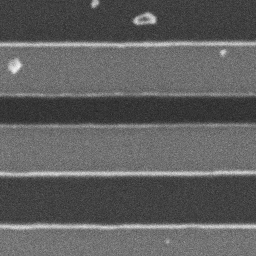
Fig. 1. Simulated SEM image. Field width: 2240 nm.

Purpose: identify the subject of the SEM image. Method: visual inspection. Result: lines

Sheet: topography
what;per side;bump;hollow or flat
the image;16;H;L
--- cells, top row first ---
HHHHHHHHHHHHHHHH
HHHHHHHHHHHHHHHH
HHHHHHHHHHHHHHHH
LLLLLLLLLLLLLLLL
LLLLLLLLLLLLLLLL
LLLLLLLLLLLLLLLL
HHHHHHHHHHHHHHHH
HHHHHHHHHHHHHHHH
LLLLLLLLLLLLLLLL
LLLLLLLLLLLLLLLL
LLLLLLLLLLLLLLLL
HHHHHHHHHHHHHHHH
HHHHHHHHHHHHHHHH
HHHHHHHHHHHHHHHH
LLLLLLLLLLLLLLLL
LLLLLLLLLLLLLLLL